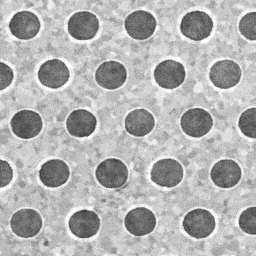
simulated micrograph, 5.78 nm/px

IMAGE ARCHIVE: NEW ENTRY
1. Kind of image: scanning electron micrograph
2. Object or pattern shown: a regular array of holes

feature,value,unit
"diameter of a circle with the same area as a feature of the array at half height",186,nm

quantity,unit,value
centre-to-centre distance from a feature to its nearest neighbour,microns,0.321